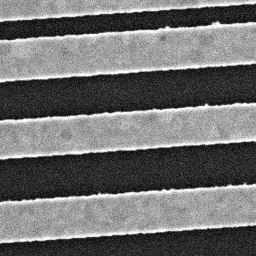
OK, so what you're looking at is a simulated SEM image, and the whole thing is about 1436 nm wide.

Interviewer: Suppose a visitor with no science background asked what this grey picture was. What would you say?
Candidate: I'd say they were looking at lines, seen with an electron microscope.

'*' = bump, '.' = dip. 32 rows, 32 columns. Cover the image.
******************************..
*****************...............
***.............................
......................**********
........************************
********************************
********************************
********************************
***********************.........
*********.......................
................................
................................
................................
.......................*********
.........***********************
********************************
********************************
********************************
*******************.............
*****...........................
................................
................................
................................
..........................******
...........*********************
********************************
********************************
********************************
***************************.....
*************...................
................................
................................